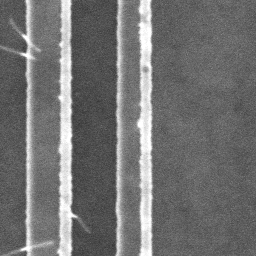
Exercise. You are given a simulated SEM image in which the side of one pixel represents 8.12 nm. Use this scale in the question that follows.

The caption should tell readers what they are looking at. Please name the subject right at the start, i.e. lines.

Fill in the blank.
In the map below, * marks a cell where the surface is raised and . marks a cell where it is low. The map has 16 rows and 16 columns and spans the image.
..**...**.......
..**...**.......
..**...**.......
..**...**.......
..**...**.......
..**...**.......
..**...**.......
..**...**.......
..**...**.......
..**...**.......
..**...**.......
..**...**.......
..**...**.......
..**...**.......
..**...**.......
..**...**.......